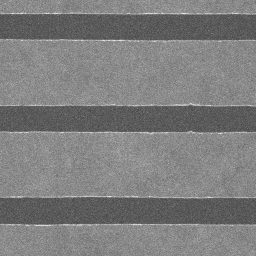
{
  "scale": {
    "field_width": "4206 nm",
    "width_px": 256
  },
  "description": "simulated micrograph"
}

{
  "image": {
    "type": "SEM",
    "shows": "one or a few lines or trenches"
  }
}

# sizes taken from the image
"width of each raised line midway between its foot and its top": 450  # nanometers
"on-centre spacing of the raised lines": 1510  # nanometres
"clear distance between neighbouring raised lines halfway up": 1060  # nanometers